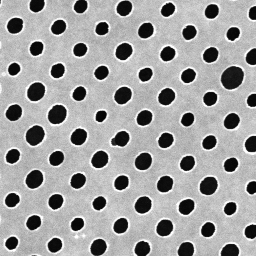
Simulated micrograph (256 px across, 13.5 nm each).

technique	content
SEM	a regular array of holes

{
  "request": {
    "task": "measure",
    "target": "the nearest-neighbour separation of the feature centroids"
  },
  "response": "0.409 micrometres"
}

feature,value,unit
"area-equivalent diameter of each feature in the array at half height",202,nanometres